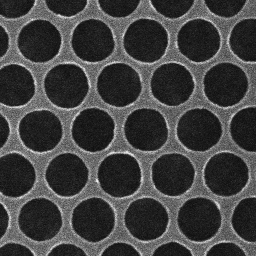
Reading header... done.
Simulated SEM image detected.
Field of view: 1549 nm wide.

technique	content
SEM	a regular array of holes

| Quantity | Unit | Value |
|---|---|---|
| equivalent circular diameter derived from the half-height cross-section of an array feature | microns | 0.264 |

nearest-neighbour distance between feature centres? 0.312 microns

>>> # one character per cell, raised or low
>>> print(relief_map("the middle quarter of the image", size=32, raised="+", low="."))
...+++++++......++++++++......++
.....+++++........+++++........+
.....++++..........+++..........
......++...........+++..........
......++...........++...........
......++...........+++..........
......++...........+++..........
......+++..........+++..........
.....++++.........+++++........+
.....+++++.......+++++++......++
....+++++++++..++++++++++++.++++
+++++.....++++++++.....+++++++++
++++.......++++++.......++++++..
+++.........++++.........++++...
++..........+++..........+++....
++...........++...........++....
++...........++...........++....
++...........++...........++....
++..........++++..........+++...
+++.........++++.........++++...
+++........++++++.......++++++..
+++++.....+++++++++....+++++++++
..++++++++++....+++++++++....+++
....++++++........+++++........+
.....++++.........+++++.........
.....++++..........+++..........
......+++..........+++..........
......++...........+++..........
......++...........+++..........
......+++..........+++..........
.....++++..........++++.........
....++++++........++++++.......+